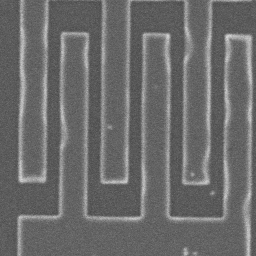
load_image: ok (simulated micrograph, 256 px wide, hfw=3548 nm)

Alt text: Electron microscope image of groups of lines, slits or small figures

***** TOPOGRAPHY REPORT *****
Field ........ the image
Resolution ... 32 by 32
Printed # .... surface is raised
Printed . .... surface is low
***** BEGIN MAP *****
...###.......###.......###......
...###.......###.......###......
...###.......###.......###......
...###.......###.......###......
...###..###..###..###..###......
...###..###..###..###...##..###.
...###..###..###..###...##..###.
...###..###..###..###..###..###.
...###..###..###..###..###..###.
...###..###..###..###..###..###.
...###..###..###..###..###..###.
...###..###..###..###..###..###.
...###..###..###..###..###..###.
...###..###..###..###..###..###.
...###..###..###..###..###..###.
..####..###..###..###..###..###.
..####..###..###..###..###..###.
..####..###..###..###..###..###.
..####..###..###..###..###..###.
..####..###..###..###..###..###.
..####..###..###..###..###..###.
..####..###..###..###..###..###.
...##...###..###..###..###..###.
........###.......###.......###.
........###.......###.......###.
........###.......###.......###.
.......####.......###.......###.
..#############################.
..#############################.
..#############################.
..#############################.
..#############################.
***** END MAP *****